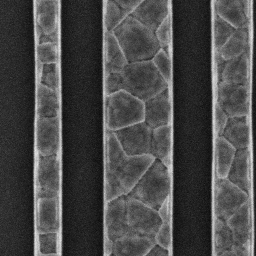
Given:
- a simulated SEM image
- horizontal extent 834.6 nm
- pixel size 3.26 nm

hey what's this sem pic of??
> one or a few lines or trenches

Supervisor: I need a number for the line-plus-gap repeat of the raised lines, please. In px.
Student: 92.3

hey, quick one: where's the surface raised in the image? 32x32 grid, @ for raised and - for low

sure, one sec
----@@@------@@@@@@@@------@@@@-
----@@@------@@@@@@@@------@@@@-
----@@@------@@@@@@@@------@@@@-
----@@@------@@@@@@@@------@@@@-
----@@@------@@@@@@@@------@@@@-
----@@@------@@@@@@@@------@@@@-
----@@@------@@@@@@@@------@@@@-
-----@@------@@@@@@@@------@@@@-
-----@@------@@@@@@@@------@@@@-
-----@@------@@@@@@@@------@@@@-
-----@@------@@@@@@@@------@@@@-
-----@@@-----@@@@@@@@------@@@@-
-----@@@-----@@@@@@@@------@@@@-
-----@@@-----@@@@@@@@------@@@@-
-----@@@-----@@@@@@@@------@@@@-
-----@@@-----@@@@@@@@------@@@@-
-----@@@-----@@@@@@@@------@@@@-
-----@@@-----@@@@@@@@------@@@@-
----@@@@-----@@@@@@@@------@@@@-
----@@@@-----@@@@@@-@------@@@@-
----@@@@-----@@@@@@-@------@@@@-
----@@@@-----@@@@@@@@------@@@@-
----@@@@-----@@@@@@@@------@@@@-
----@@@------@@@@@@@@------@@@@-
----@@@------@@--@@@@------@@@@-
----@@@------@@@@@@@@------@@@@@
----@@@------@@@@@@@@------@@@@@
----@@@------@@@@@@@@------@@@@@
----@@@------@@@@@@@@------@@@@@
----@@@------@@@@@@@@------@@@@@
----@@@------@@@@@@@@------@@@@@
----@@@------@@@@@@@-------@@@@@